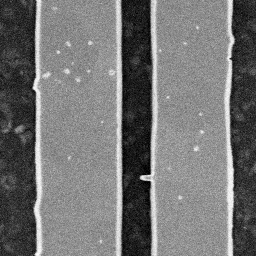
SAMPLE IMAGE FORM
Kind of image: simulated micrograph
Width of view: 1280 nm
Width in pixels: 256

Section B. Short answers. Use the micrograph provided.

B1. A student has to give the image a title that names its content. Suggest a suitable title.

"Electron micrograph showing one or a few lines or trenches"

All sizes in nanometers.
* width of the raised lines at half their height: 403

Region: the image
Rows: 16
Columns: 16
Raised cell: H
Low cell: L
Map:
LLHHHHHLLLHHHHLL
LLHHHHHLLLHHHHLL
LLHHHHHLLLHHHHHL
LLHHHHHLLLHHHHLL
LLHHHHHHLLHHHHLL
LLHHHHHHLLHHHHLL
LLHHHHHHLLHHHHLL
LLHHHHHLLLHHHHLL
LLHHHHHLLLHHHHLL
LLHHHHHLLLHHHHLL
LLHHHHHHLHHHHHLL
LLHHHHHHLHHHHHLL
LLHHHHHHLLHHHHLL
LLHHHHHHLLHHHHLL
LLHHHHHLLLHHHHLL
LLHHHHHLLLHHHHLL